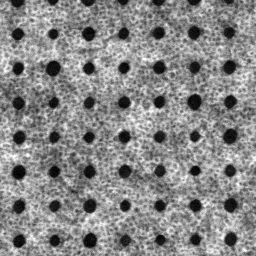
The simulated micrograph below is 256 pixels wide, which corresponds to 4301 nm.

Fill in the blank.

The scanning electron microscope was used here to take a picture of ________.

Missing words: a regular array of raised bodies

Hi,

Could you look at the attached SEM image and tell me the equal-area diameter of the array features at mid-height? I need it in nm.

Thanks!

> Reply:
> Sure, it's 221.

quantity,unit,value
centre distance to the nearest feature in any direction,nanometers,250